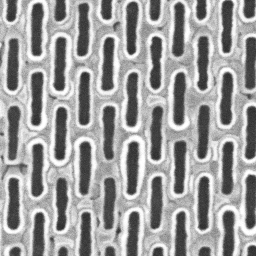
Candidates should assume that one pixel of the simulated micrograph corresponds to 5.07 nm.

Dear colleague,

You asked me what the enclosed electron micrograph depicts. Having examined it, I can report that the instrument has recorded a regular array of holes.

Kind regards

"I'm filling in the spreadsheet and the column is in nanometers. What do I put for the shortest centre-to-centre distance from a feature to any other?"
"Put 208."